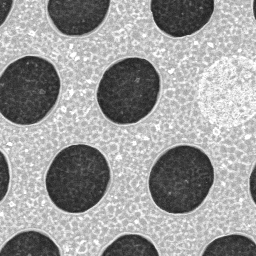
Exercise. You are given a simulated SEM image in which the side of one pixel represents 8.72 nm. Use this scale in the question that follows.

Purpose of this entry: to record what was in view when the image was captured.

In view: holes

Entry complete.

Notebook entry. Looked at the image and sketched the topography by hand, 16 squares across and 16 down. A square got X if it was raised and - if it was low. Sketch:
-XX----XX----XXX
XXX---XXXX---XXX
XXXXXXXXXXXXXXXX
XXXXXXXXXXXXXXXX
----XXX---XXXXXX
----XX----XXXXXX
---XXX----XXXXXX
X--XXXX--XXXXXXX
XXXXXXXXXXXXXXXX
XXXX--XXXX---XXX
-XX----XXX---XXX
-XX----XX----XXX
XXX---XXXX---XXX
XXXXXXXXXXXXXXXX
X-XXXXXXXXXXXXXX
----XXX---XXX---